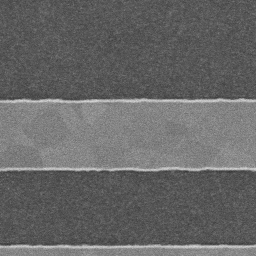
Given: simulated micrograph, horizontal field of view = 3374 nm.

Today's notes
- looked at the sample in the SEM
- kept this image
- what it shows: one or a few lines or trenches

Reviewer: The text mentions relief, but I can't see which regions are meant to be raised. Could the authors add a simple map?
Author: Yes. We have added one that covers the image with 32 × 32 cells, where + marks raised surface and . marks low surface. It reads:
................................
................................
................................
................................
................................
................................
................................
................................
................................
................................
................................
................................
................................
++++++++++++++++++++++++++++++++
++++++++++++++++++++++++++++++++
++++++++++++++++++++++++++++++++
++++++++++++++++++++++++++++++++
++++++++++++++++++++++++++++++++
++++++++++++++++++++++++++++++++
++++++++++++++++++++++++++++++++
++++++++++++++++++++++++++++++++
................................
................................
................................
................................
................................
................................
................................
................................
................................
................................
++++++++++++++++++++++++++++++++